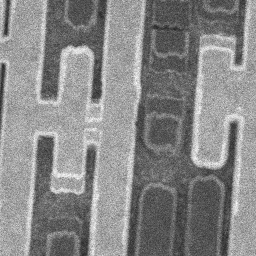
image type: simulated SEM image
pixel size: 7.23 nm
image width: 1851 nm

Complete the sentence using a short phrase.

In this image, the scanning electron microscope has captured parallel lines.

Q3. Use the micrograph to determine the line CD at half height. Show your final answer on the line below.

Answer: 0.249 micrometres